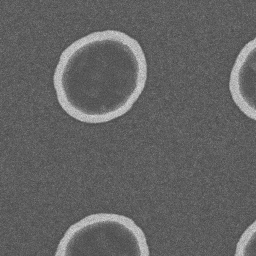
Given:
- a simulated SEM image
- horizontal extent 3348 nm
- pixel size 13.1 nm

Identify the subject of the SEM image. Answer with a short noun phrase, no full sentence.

raised bodies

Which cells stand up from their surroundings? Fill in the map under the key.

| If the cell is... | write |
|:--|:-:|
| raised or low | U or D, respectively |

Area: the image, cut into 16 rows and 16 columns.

DDDDDDDDDDDDDDDD
DDDDDDDDDDDDDDDD
DDDDDUUUDDDDDDDD
DDDDUUUUUDDDDDDU
DDDDUUUUUDDDDDDU
DDDDUUUUUDDDDDDU
DDDDUUUUDDDDDDDU
DDDDDDDDDDDDDDDD
DDDDDDDDDDDDDDDD
DDDDDDDDDDDDDDDD
DDDDDDDDDDDDDDDD
DDDDDDDDDDDDDDDD
DDDDDDDDDDDDDDDD
DDDDDDDDDDDDDDDD
DDDDUUUUUDDDDDDD
DDDDUUUUUDDDDDDU